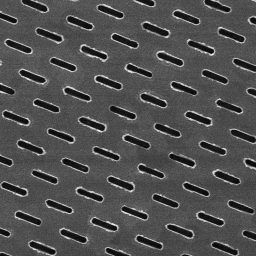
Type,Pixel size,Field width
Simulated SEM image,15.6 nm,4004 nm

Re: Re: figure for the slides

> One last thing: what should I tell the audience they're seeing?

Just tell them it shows a regular array of holes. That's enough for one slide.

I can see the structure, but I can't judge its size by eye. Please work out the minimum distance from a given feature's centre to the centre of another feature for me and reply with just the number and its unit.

510 nanometres